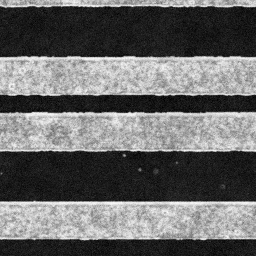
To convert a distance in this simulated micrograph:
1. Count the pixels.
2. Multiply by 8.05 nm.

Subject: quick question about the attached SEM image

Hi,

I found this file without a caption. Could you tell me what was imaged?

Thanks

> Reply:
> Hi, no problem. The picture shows lines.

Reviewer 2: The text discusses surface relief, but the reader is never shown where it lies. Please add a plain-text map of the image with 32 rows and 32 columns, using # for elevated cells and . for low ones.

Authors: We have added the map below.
################################
................................
................................
................................
................................
................................
................................
################################
################################
################################
################################
################################
................................
................................
################################
################################
################################
################################
################################
................................
................................
................................
................................
................................
................................
################################
################################
################################
################################
################################
................................
................................